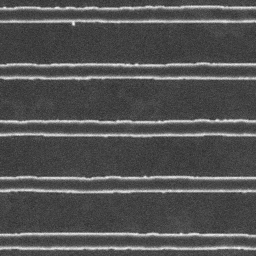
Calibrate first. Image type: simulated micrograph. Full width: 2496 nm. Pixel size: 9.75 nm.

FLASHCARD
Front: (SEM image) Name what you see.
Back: lines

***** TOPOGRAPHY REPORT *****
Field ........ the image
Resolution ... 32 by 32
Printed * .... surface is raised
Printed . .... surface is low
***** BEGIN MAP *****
................................
********************************
********************************
................................
................................
................................
................................
................................
********************************
********************************
................................
................................
................................
................................
................................
********************************
********************************
................................
................................
................................
................................
................................
********************************
********************************
................................
................................
................................
................................
................................
********************************
********************************
................................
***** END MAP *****